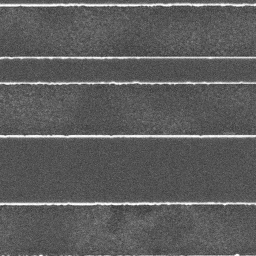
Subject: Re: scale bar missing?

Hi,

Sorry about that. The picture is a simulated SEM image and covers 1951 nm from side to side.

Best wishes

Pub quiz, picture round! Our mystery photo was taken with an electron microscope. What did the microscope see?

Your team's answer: lines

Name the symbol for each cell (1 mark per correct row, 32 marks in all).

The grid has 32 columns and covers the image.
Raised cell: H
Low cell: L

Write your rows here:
HHHHHHHHHHHHHHHHHHHHHHHHHHHHHHHH
LLLLLLLLLLLLLLLLLLLLLLLLLLLLLLLL
LLLLLLLLLLLLLLLLLLLLLLLLLLLLLLLL
LLLLLLLLLLLLLLLLLLLLLLLLLLLLLLLL
LLLLLLLLLLLLLLLLLLLLLLLLLLLLLLLL
LLLLLLLLLLLLLLLLLLLLLLLLLLLLLLLL
LLLLLLLLLLLLLLLLLLLLLLLLLLLLLLLL
HHHHHHHHHHHHHHHHHHHHHHHHHHHHHHHH
HHHHHHHHHHHHHHHHHHHHHHHHHHHHHHHH
HHHHHHHHHHHHHHHHHHHHHHHHHHHHHHHH
LLLLLLLLLLLLLLLLLLLLLLLLLLLLLLLL
LLLLLLLLLLLLLLLLLLLLLLLLLLLLLLLL
LLLLLLLLLLLLLLLLLLLLLLLLLLLLLLLL
LLLLLLLLLLLLLLLLLLLLLLLLLLLLLLLL
LLLLLLLLLLLLLLLLLLLLLLLLLLLLLLLL
LLLLLLLLLLLLLLLLLLLLLLLLLLLLLLLL
LLLLLLLLLLLLLLLLLLLLLLLLLLLLLLLL
HHHHHHHHHHHHHHHHHHHHHHHHHHHHHHHH
HHHHHHHHHHHHHHHHHHHHHHHHHHHHHHHH
HHHHHHHHHHHHHHHHHHHHHHHHHHHHHHHH
HHHHHHHHHHHHHHHHHHHHHHHHHHHHHHHH
HHHHHHHHHHHHHHHHHHHHHHHHHHHHHHHH
HHHHHHHHHHHHHHHHHHHHHHHHHHHHHHHH
HHHHHHHHHHHHHHHHHHHHHHHHHHHHHHHH
HHHHHHHHHHHHHHHHHHHHHHHHHHHHHHHH
HHHHHHHHHHHHLLHLHLHLLLLLLLLHLLLL
LLLLLLLLLLLLLLLLLLLLLLLLLLLLLLLL
LLLLLLLLLLLLLLLLLLLLLLLLLLLLLLLL
LLLLLLLLLLLLLLLLLLLLLLLLLLLLLLLL
LLLLLLLLLLLLLLLLLLLLLLLLLLLLLLLL
LLLLLLLLLLLLLLLLLLLLLLLLLLLLLLLL
LLLLLLLLLLLLLLLLLLLLLLLLLLLLLLLL